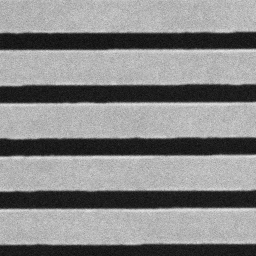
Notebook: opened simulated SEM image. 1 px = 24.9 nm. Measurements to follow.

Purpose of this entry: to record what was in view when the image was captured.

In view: lines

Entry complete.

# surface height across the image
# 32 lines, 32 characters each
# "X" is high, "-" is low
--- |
XXXXXXXXXXXXXXXXXXXXXXXXXXXXXXXX
XXXXXXXXXXXXXXXXXXXXXXXXXXXXXXXX
XXXXXXXXXXXXXXXXXXXXXXXXXXXXXXXX
XXXXXXXXXXXXXXXXXXXXXXXXXXXXXXXX
--------------------------------
--------------------------------
XXXXXXXXXXXXXXXXXXXXXXXXXXXXXXXX
XXXXXXXXXXXXXXXXXXXXXXXXXXXXXXXX
XXXXXXXXXXXXXXXXXXXXXXXXXXXXXXXX
XXXXXXXXXXXXXXXXXXXXXXXXXXXXXXXX
XXXXXXXXXXXXXXXXXXXXXXX------XX-
--------------------------------
--------------------------------
XXXXXXXXXXXXXXXXXXXXXXXXXXXXXXXX
XXXXXXXXXXXXXXXXXXXXXXXXXXXXXXXX
XXXXXXXXXXXXXXXXXXXXXXXXXXXXXXXX
XXXXXXXXXXXXXXXXXXXXXXXXXXXXXXXX
--------------------------------
--------------------------------
---------------------------XXX-X
XXXXXXXXXXXXXXXXXXXXXXXXXXXXXXXX
XXXXXXXXXXXXXXXXXXXXXXXXXXXXXXXX
XXXXXXXXXXXXXXXXXXXXXXXXXXXXXXXX
XXXXXXXXXXXXXXXXXXXXXXXXXXXXXXXX
--------------------------------
--------------------------------
XXXXXXXXXXXXXXXXXXXXXXXXXXXXXXXX
XXXXXXXXXXXXXXXXXXXXXXXXXXXXXXXX
XXXXXXXXXXXXXXXXXXXXXXXXXXXXXXXX
XXXXXXXXXXXXXXXXXXXXXXXXXXXXXXXX
XXXXX-XXXXXXXXXXXX--------------
--------------------------------